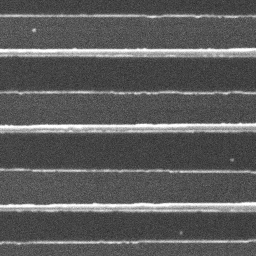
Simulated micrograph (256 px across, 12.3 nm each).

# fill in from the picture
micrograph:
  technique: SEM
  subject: lines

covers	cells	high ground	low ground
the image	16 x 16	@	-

@@@@@@@@@@@@@@@@
----------------
----------------
@@@@@@@@@@@@@@@@
@@@@@@@@@@@@@@@@
@@@@@@@@@@@@@@@@
----------------
----------------
@@@@@@@@@@@@@@@@
@@@@@@@@@@@@@@@@
@@@@@@@@@@@@@@@@
----------------
----------------
@@@@@@@@@@@@@@@@
@@@@@@@@@@@@@@@@
----------------